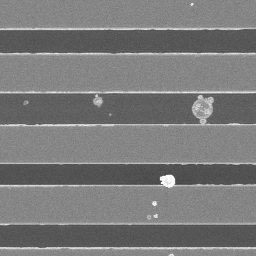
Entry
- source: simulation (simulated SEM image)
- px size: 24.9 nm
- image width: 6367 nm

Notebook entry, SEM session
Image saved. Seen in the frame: lines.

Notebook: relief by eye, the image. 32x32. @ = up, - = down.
@@@@@@@@@@@@@@@@@@@@@@@@@@@@@@@@
@@@@@@@@@@@@@@@@@@@@@@@@@@@@@@@@
@@@@@@@@@@@@@@@@@@@@@@@@@@@@@@@@
@@@@@@@@@@@@@@@@@@@@@@@@@@@@@@@@
--------------------------------
--------------------------------
--------------------------------
@@@@@@@@@@@@@@@@@@@@@@@@@@@@@@@@
@@@@@@@@@@@@@@@@@@@@@@@@@@@@@@@@
@@@@@@@@@@@@@@@@@@@@@@@@@@@@@@@@
@@@@@@@@@@@@@@@@@@@@@@@@@@@@@@@@
@@@@@@@@@@@@@@@@@@@@@@@@@@@@@@@@
--------------------------------
--------------------------------
--------------------------------
-----------------------@--@-@@--
@@@@@@@@@@@@@@@@@@@@@@@@@@@@@@@@
@@@@@@@@@@@@@@@@@@@@@@@@@@@@@@@@
@@@@@@@@@@@@@@@@@@@@@@@@@@@@@@@@
@@@@@@@@@@@@@@@@@@@@@@@@@@@@@@@@
-------@-------@----@-@@@@@-@@@@
--------------------------------
--------------------@@----------
@@@@@@@@@@@@@@@@@@@@@@@@@@@@@@@@
@@@@@@@@@@@@@@@@@@@@@@@@@@@@@@@@
@@@@@@@@@@@@@@@@@@@@@@@@@@@@@@@@
@@@@@@@@@@@@@@@@@@@@@@@@@@@@@@@@
@@@@@@@@@@@@@@@@@@@@@@@@@@@@@@@@
--------------------------------
--------------------------------
--------------------------------
@@@@@@@@@@@@@@@@@@@@@@@@@@@@@@@@